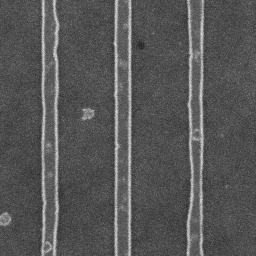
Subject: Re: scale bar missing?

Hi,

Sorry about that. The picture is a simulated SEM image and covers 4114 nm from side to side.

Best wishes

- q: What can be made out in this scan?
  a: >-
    one or a few lines or trenches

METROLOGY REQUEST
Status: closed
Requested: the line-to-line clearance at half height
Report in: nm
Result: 964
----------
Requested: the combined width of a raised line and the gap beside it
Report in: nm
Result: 1170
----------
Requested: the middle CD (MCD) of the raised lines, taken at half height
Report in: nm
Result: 209